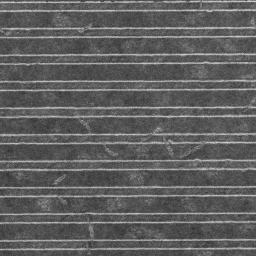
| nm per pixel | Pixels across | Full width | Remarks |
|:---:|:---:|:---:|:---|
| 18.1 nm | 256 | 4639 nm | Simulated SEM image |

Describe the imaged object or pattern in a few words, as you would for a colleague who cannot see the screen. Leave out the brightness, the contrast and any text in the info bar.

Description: parallel lines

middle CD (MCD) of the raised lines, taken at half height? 320 nanometres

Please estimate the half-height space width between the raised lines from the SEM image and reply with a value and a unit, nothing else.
159 nm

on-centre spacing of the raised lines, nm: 480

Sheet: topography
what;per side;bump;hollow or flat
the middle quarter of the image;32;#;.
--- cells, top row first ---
################################
################################
################################
################################
................................
................................
................................
################################
################################
################################
################################
................................
................................
################################
################################
################################
################################
###############################.
................................
.........................#......
################################
################################
################################
################################
................................
................................
....##...##.#.....######.....#..
################################
################################
################################
################################
................................